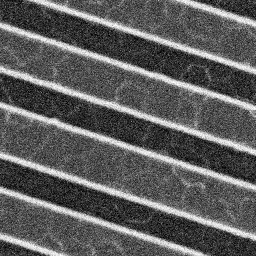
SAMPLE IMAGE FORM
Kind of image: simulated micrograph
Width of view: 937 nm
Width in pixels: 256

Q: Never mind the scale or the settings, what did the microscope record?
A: one or a few lines or trenches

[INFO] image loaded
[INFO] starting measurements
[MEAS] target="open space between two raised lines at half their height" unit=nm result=120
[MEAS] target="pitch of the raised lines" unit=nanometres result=288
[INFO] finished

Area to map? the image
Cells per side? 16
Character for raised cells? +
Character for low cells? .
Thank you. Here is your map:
....+++++++++...
.......+++++++++
+++.......++++++
++++++.......+++
+++++++++.......
...+++++++++....
.......++++++++.
+++.......++++++
++++++.......+++
+++++++++.......
..++++++++++....
.....++++++++++.
++......++++++++
+++++.......++++
++++++++.......+
..+++++++++.....